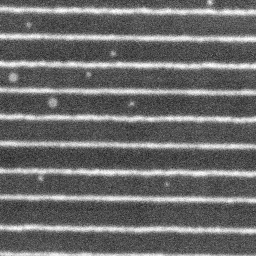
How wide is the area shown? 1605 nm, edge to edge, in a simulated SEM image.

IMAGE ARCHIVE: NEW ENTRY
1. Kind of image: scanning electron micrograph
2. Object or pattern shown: lines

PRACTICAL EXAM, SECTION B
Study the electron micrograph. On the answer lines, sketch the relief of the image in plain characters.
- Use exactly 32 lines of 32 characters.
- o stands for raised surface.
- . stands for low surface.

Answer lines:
................................
ooooooooooooooooooooooooooo.oo.o
oooooooooooooooooooooooooooooooo
oooooooooooooooooooooooooooooooo
oooooooooooooooooooooooooooooooo
................................
................................
................................
oooooooooooooooooooooooooooooooo
oooooooooooooooooooooooooooooooo
oooooooooooooooooooooooooooooooo
........................oooooooo
................................
................................
................................
oooooooooooooooooooooooooooooooo
oooooooooooooooooooooooooooooooo
oooooooooooooooooooooooooooooooo
................................
................................
................................
ooooooooooooooooo..o.oo...o.....
oooooooooooooooooooooooooooooooo
oooooooooooooooooooooooooooooooo
oooooooooooooooooooooooooooooooo
................................
................................
................................
oooooooo........................
oooooooooooooooooooooooooooooooo
oooooooooooooooooooooooooooooooo
oooooooooooooooooooooooooooooooo